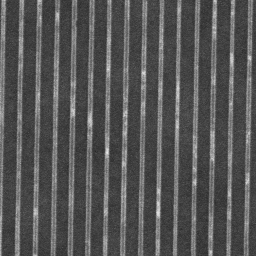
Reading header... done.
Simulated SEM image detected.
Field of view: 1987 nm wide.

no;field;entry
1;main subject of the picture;parallel lines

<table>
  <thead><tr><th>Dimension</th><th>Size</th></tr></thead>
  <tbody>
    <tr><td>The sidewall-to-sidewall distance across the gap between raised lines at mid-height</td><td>0.107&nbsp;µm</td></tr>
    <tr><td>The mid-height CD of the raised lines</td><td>3.88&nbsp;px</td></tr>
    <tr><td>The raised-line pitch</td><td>137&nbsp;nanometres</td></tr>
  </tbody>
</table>